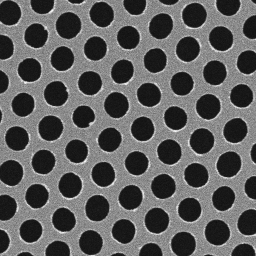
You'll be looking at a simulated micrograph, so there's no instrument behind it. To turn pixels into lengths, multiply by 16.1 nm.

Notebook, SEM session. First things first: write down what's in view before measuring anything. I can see a regular array of holes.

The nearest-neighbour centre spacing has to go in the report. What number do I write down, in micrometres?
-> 0.555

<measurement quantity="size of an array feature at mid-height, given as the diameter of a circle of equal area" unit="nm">391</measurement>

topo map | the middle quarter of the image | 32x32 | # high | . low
..##########.....###.....#######
.###########.....####....#######
#####....###.....###########...#
####.....###.....##########.....
###......####...###########.....
####.....##########....####.....
.###.....#########......###.....
.####...###....###......####...#
.##########.....##......########
##########......###.....########
####..####......####...#########
###....###......##########....##
##......###....##########......#
##......####.#####...####......#
##.....##########.....###......#
###...###########.....####....##
##########...####......#####.###
#########.....###.....##########
#########.....####....##########
#....###......##########....###.
#.....###.....#########......###
......####...##########......###
......##########....###......###
#....###########.....###.....###
##..#####.#####......####...####
########....###......##########.
#######......###.....#########..
...####......####...##########..
....###......##########....###..
....####....##########......###.
.....####..####...####......####
....###########....###......####